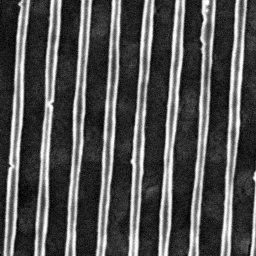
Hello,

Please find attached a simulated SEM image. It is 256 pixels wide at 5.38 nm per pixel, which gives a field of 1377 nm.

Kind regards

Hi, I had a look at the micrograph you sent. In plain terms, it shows parallel lines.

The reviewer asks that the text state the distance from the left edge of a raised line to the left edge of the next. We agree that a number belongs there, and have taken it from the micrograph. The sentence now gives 166 nm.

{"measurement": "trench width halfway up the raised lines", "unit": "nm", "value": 125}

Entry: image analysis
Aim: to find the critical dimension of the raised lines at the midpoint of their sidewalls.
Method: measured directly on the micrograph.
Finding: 41.6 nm